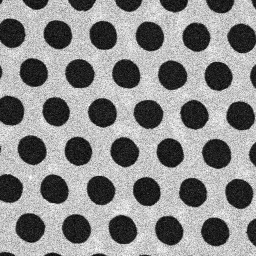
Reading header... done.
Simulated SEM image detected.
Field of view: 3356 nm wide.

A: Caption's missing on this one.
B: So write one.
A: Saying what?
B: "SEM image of a regular array of holes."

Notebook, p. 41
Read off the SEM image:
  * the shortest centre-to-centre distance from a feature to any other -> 589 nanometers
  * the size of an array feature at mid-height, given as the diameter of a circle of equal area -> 28.8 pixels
